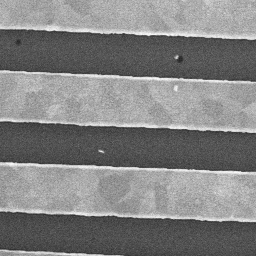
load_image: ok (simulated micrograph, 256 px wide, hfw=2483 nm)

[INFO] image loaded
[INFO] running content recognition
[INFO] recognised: lines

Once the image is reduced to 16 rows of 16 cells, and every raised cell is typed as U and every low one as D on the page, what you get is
UUUUUUUUUUUUUUUU
UUUUUUUUUUUUUUUU
DDDDDDDDDDDDDDDD
DDDDDDDDDDDDDDDD
UUDDDDDDDDDDDDDD
UUUUUUUUUUUUUUUU
UUUUUUUUUUUUUUUU
UUUUUUUUUUUUUUUU
DDDDDDDDDDDDDDDD
DDDDDDDDDDDDDDDD
UUUUUUUUDDDDDDDD
UUUUUUUUUUUUUUUU
UUUUUUUUUUUUUUUU
DDDDDDDUUUUUUUUU
DDDDDDDDDDDDDDDD
DDDDDDDDDDDDDDDD